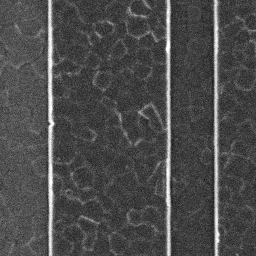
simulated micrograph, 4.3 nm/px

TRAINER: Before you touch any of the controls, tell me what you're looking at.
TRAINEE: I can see one or a few lines or trenches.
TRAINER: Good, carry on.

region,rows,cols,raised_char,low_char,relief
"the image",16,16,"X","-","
---XXXXXXXX--XXX
---XXXXXXXX--XXX
---XXXXXXXX--XXX
---XXXXXXXX--XXX
---XXXXXXXX--XXX
---XXXXXXXX--XXX
---XXXXXXXX--XXX
---XXXXXXXX--XXX
---XXXXXXXX--XXX
---XXXXXXXX--XXX
---XXXXXXXX--XXX
---XXXXXXXX--XXX
---XXXXXXXX--XXX
---XXXXXXXX--XXX
---XXXXXXXX--XXX
---XXXXXXXX--XXX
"